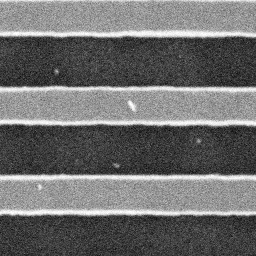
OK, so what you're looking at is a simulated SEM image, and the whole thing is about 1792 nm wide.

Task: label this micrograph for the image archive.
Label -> lines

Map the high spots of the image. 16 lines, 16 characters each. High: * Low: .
****************
****************
................
................
................
**************.*
****************
****************
................
................
................
****************
****************
................
................
................